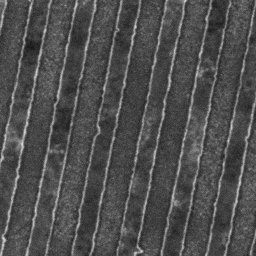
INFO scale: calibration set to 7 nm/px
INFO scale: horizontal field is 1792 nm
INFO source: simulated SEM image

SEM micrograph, parallel lines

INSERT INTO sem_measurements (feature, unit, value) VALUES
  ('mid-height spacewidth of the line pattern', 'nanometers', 172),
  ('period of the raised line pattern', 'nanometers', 308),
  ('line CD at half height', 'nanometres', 130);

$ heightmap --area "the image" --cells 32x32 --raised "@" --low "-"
@---@@----@@---@@----@@---@@@---
----@@---@@@---@@----@@---@@@---
---@@@---@@@---@@---@@@---@@---@
---@@@---@@----@@---@@@---@@---@
---@@----@@---@@@---@@---@@@---@
---@@---@@@---@@@---@@---@@@---@
---@@---@@@---@@----@@---@@@---@
--@@@---@@@---@@---@@@---@@---@@
--@@@---@@----@@---@@----@@---@@
--@@----@@---@@@---@@----@@---@@
--@@----@@---@@@---@@---@@@---@@
--@@---@@@---@@----@@---@@@---@@
--@@---@@@---@@---@@@---@@----@@
-@@@---@@----@@---@@@---@@---@@@
-@@@---@@---@@@---@@----@@---@@@
-@@---@@@---@@@---@@---@@@---@@-
-@@---@@@---@@----@@---@@@---@@-
-@@---@@@---@@---@@@---@@----@@-
@@@---@@----@@---@@@---@@---@@@-
@@@---@@---@@@---@@----@@---@@@-
@@----@@---@@@---@@---@@@---@@--
@@---@@@---@@----@@---@@@---@@--
@@---@@@---@@---@@@---@@----@@--
@@---@@----@@---@@@---@@---@@@--
@@---@@---@@@---@@----@@---@@@--
@----@@---@@@---@@---@@@---@@@--
@---@@@---@@----@@---@@@---@@---
@---@@@---@@---@@@---@@----@@---
@---@@@---@@---@@@---@@---@@@---
@---@@---@@@---@@----@@---@@@---
----@@---@@@---@@---@@@---@@@---
---@@@---@@----@@---@@@---@@---@